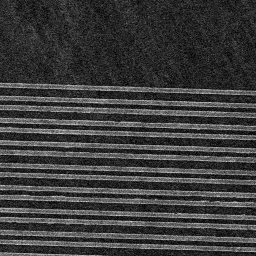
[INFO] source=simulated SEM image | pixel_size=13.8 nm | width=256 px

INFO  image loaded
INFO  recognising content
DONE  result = parallel lines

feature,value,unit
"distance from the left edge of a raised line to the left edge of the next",155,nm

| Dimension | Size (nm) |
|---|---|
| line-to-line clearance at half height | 112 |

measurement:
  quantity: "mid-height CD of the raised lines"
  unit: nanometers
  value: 50.1